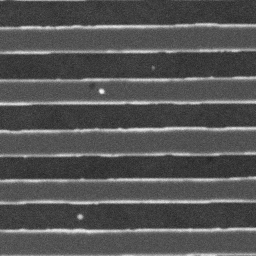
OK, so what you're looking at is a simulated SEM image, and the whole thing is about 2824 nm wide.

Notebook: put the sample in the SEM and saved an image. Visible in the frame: lines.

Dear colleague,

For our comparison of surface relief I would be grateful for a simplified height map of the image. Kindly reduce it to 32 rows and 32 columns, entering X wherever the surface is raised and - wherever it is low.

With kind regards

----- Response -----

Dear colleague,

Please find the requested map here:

--------------------------------
--------------------------------
--------------------------------
XXXXXXXXXXXXXXXXXXXXXXXXXXXXXXXX
XXXXXXXXXXXXXXXXXXXXXXXXXXXXXXXX
XXXXXXXXXXXXXXXXXXXXXXXXXXXXXXXX
XXXXXXXXXXXXXXXXXXXXXX----------
--------------------------------
--------------------------------
--------------------------------
XXXXXXXXXXXXXXXXXXXXXXXXXXXXXXXX
XXXXXXXXXXXXXXXXXXXXXXXXXXXXXXXX
XXXXXXXXXXXXXXXXXXXXXXXXXXXXXXXX
--------------------------------
--------------------------------
--------------------------------
XXXXXXXXXXXXXXXXXXXXXXXXXXXXXXXX
XXXXXXXXXXXXXXXXXXXXXXXXXXXXXXXX
XXXXXXXXXXXXXXXXXXXXXXXXXXXXXXXX
--------------------------------
--------------------------------
--------------------------------
-------------XXXXXXXXXXXXXXXXXXX
XXXXXXXXXXXXXXXXXXXXXXXXXXXXXXXX
XXXXXXXXXXXXXXXXXXXXXXXXXXXXXXXX
--------------------------------
--------------------------------
--------------------------------
--------------------------------
XXXXXXXXXXXXXXXXXXXXXXXXXXXXXXXX
XXXXXXXXXXXXXXXXXXXXXXXXXXXXXXXX
XXXXXXXXXXXXXXXXXXXXXXXXXXXXXXXX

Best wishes